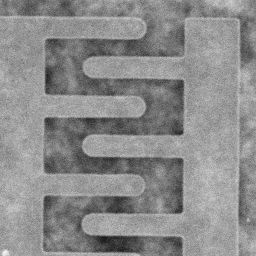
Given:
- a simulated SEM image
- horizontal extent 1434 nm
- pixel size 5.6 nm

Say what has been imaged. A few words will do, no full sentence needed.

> groups of lines, slits or small figures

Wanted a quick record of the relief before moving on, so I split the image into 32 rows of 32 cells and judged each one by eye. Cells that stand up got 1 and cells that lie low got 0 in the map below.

00000000000000000000000000000000
00000000000000000000000000000000
11111111111111111100000111111100
11111111111111111100000111111100
11111111111111111100000111111100
11111100000000000000000111111100
11111000000000000000000111111100
11111000000111111111111111111100
11111100001111111111111111111100
11111100000111111111111111111100
11111100000000000000000111111100
11111100000000000000000111111100
11111111111111111100000111111100
11111111111111111100000111111100
11111111111111111000000111111100
11111000000000000000000111111100
11111000000000000000000111111100
11111000000111111111111111111100
11111000001111111111111111111100
11111000000111111111111111111100
11111000000000000000000111111100
11111100000000000000000111111100
11111111111111111100000111111100
11111111111111111100000111111100
11111100000000000000000111111100
11111000000000000000000111111100
11111000000000000000000111111100
11111000001111111111111111111100
11111000001111111111111111111100
11111000000000000000001111111100
11111000000000000000000111111100
11111100000000000000000111111100